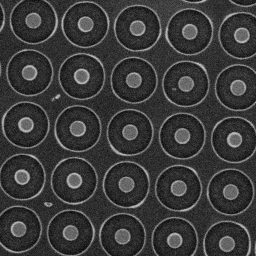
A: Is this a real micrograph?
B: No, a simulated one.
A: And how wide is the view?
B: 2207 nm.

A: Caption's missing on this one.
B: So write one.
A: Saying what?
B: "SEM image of an array of small figures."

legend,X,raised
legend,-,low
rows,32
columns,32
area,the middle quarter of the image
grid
---------XXXX---------XXXXX-----
----------XX-----------XXX------
---XXX----XX-----X-----XX-------
---XXX----XX----XXX----XX-----XX
----X-----XX----XXX----XX----XXX
----------XX----XXX----XX----XXX
---------XXX-----------XX-----X-
X-------XXXXX---------XXX-------
XX----XXXXXXXX-------XXXXX------
XXXXXXXXXXXXXXXX---XXXXXXXX-----
XXXXXXXXXXXXXXXXXXXXXXXXXXXXXX-X
-------XXXXXXXXX-XXXXXXXXXXXXXXX
--------XXXXX-------XXXXXXXXX--X
--------XXXX---------XXXXX------
---X-----XXX----------XXX-------
--XXX----XX-----X-----XXX-------
--XXX----XX----XXX----XX-----X--
--XX-----XX----XXX----XX----XXX-
---------XX----XXX----XX----XXX-
--------XXX----------XXX-----XX-
-------XXXXX---------XXX--------
XX---XXXXXXXX-------XXXXX-------
XXXXXXXXXXXXXX----XXXXXXXX------
XX--XXXXXXXXXXXXXXXXXXXXXXXX---X
------XXXXXXXXX-XXXXXXXXXXXXXXXX
-------XXXXX-------XXXXXXXXX-XXX
--------XXX---------XXXXX-------
--------XXX----------XXX--------
-XXX----XX-----XX----XXX--------
-XXX----XX----XXX----XX-----XX--
--XX----XX----XXX----XX----XXX--
--------XX----XXX----XX----XXX--